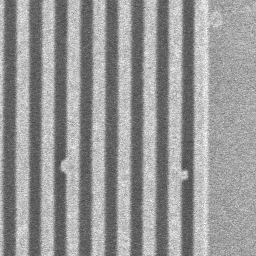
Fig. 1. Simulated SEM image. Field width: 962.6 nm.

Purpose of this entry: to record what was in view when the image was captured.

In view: parallel lines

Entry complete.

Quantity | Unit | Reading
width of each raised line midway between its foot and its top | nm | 48.4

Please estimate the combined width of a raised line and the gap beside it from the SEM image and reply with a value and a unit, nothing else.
95.6 nanometers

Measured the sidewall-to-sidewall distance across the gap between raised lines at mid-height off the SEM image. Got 45.1 nanometers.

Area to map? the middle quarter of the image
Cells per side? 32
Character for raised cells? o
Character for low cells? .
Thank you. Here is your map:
.ooo...ooo....ooo...ooo...ooo...
.ooo...ooo....ooo...ooo...ooo...
.ooo...ooo....ooo...ooo...ooo...
.ooo...ooo....ooo...ooo...ooo...
.ooo...ooo....ooo...ooo...ooo...
.ooo...ooo....ooo...ooo...ooo...
.ooo...ooo....ooo...ooo...ooo...
.ooo...ooo....ooo...ooo...ooo...
.ooo...ooo....ooo...ooo...ooo...
.ooo...ooo...oooo...ooo...ooo...
.ooo...ooo...oooo...ooo...ooo...
.ooo...ooo...oooo...ooo...ooo...
.ooo...ooo...oooo...ooo...ooo...
.ooo...ooo...oooo...ooo...ooo...
.ooo...ooo...oooo...ooo...ooo...
.ooo...ooo...oooo...ooo...ooo...
.ooo...ooo....ooo...ooo...ooo...
.ooo...ooo....ooo...ooo...ooo...
.ooo...ooo....ooo...ooo...ooo...
.ooo...ooo....ooo...ooo...ooo...
.ooo...ooo...oooo...ooo...ooo...
.ooo...ooo...oooo...ooo...ooo...
.ooo...ooo...oooo...ooo...ooo...
oooo...ooo...oooo...ooo...ooo...
oooo...ooo...oooo...ooo...ooo...
oooo...ooo...oooo...ooo...ooo...
oooo...ooo...oooo...ooo...ooo...
oooo...ooo...oooo...ooo...ooooo.
.ooo...ooo...oooo...ooo...ooooo.
.ooo...ooo...oooo...ooo...ooo...
.ooo...ooo...oooo...ooo...ooo...
.ooo...ooo...oooo...ooo...ooo...